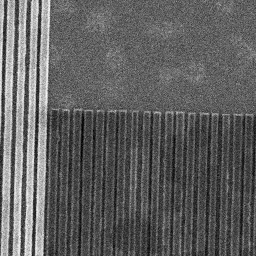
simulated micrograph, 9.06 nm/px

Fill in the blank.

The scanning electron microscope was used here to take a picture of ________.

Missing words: parallel lines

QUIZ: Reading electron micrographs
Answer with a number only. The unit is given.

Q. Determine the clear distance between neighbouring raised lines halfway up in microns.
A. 0.0441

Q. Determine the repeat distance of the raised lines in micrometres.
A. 0.104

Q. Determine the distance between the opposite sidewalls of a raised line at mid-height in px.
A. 6.88